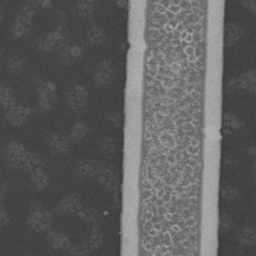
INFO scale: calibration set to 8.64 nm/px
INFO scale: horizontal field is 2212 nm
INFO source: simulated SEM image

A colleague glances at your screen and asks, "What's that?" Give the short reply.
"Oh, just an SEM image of one or a few lines or trenches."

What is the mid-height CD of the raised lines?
664 nm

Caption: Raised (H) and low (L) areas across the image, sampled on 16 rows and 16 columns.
LLLLLLLLLHHHHLLL
LLLLLLLLLHHHHLLL
LLLLLLLLLHHHHLLL
LLLLLLLLLHHHHLLL
LLLLLLLLLHHHHLLL
LLLLLLLLHHHHHLLL
LLLLLLLLHHHHHLLL
LLLLLLLLHHHHHLLL
LLLLLLLLHHHHHLLL
LLLLLLLLHHHHHLLL
LLLLLLLLHHHHHLLL
LLLLLLLLHHHHHLLL
LLLLLLLLHHHHHLLL
LLLLLLLLHHHHHLLL
LLLLLLLLHHHHHLLL
LLLLLLLLHHHHHLLL